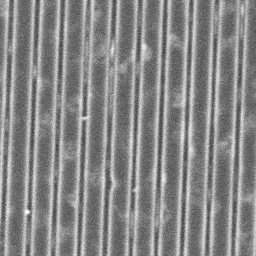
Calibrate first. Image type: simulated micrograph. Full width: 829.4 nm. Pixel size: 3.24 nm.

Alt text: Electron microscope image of parallel lines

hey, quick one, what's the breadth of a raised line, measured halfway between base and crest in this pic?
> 64.7 nanometres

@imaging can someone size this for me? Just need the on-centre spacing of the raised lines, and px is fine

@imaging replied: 25.6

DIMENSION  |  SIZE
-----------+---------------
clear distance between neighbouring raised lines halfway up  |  19 nm